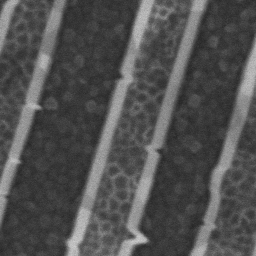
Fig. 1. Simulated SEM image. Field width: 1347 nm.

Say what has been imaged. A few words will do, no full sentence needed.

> one or a few lines or trenches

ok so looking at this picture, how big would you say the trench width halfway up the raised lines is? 398 nm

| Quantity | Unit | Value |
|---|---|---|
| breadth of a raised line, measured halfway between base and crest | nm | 259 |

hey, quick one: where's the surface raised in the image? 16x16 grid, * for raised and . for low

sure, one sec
.***.....***....
***......***....
***.....****....
***.....***.....
**......***.....
**......***....*
**.....****....*
**.....***.....*
*......***.....*
*.....****....**
*.....***.....**
......***....***
.....****....***
.....***.....***
.....***.....***
.....***....****